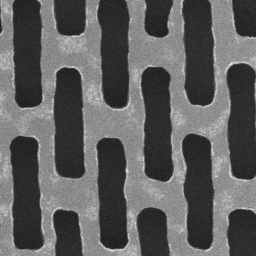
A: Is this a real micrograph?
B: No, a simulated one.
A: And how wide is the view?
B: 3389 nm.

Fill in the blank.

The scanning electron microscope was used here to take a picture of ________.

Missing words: holes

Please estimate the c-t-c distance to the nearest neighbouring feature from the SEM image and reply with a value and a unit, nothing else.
1080 nm